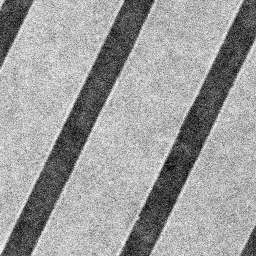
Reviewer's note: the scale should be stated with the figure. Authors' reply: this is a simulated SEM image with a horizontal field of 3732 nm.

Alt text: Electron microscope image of one or a few lines or trenches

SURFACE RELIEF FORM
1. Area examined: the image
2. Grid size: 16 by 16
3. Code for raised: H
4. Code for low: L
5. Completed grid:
LLHHHHHLLLHHHHHL
LHHHHHHLLHHHHHLL
LHHHHHLLLHHHHHLL
LHHHHHLLHHHHHLLL
HHHHHHLLHHHHHLLH
HHHHHLLHHHHHLLLH
HHHHHLLHHHHHLLHH
HHHHLLHHHHHLLLHH
HHHHLLHHHHHLLHHH
HHHLLHHHHHLLLHHH
HHHLLHHHHHLLHHHH
HHLLHHHHHLLLHHHH
HHLLHHHHHLLHHHHH
HLLHHHHHHLLHHHHH
HLLHHHHHLLHHHHHH
LLHHHHHHLLHHHHHL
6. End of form